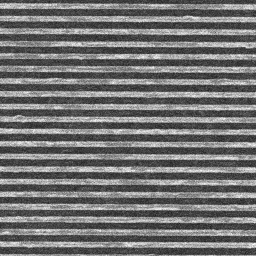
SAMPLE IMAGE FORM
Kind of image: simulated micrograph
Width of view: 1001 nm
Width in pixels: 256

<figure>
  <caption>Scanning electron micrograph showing parallel lines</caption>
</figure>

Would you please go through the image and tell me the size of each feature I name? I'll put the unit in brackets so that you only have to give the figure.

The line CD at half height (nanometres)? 20.1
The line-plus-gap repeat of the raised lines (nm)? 49.1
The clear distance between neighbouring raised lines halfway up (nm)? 29.8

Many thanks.